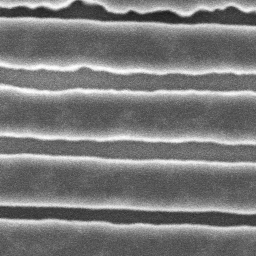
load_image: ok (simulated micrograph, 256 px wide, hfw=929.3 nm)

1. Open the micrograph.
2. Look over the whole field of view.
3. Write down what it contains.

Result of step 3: one or a few lines or trenches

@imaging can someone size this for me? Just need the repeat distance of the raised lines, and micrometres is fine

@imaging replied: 0.25